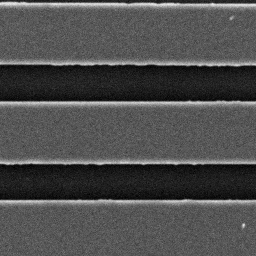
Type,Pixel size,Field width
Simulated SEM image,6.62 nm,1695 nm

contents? lines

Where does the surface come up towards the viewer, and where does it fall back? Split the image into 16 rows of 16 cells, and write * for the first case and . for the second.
****************
****************
****************
****************
................
................
****************
****************
****************
****************
................
................
......*....*....
****************
****************
****************